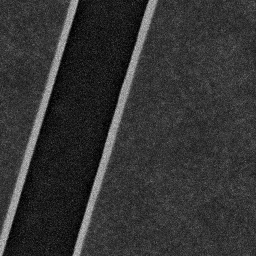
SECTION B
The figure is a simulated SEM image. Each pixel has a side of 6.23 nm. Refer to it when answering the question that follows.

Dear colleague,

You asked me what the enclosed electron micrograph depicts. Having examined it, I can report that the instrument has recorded one or a few lines or trenches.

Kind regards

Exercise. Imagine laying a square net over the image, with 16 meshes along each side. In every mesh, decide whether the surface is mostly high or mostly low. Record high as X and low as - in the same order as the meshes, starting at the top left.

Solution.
XXXXX----XXXXXXX
XXXX-----XXXXXXX
XXXX-----XXXXXXX
XXXX----XXXXXXXX
XXX-----XXXXXXXX
XXX-----XXXXXXXX
XXX-----XXXXXXXX
XX-----XXXXXXXXX
XX-----XXXXXXXXX
XX-----XXXXXXXXX
XX----XXXXXXXXXX
X-----XXXXXXXXXX
X-----XXXXXXXXXX
X----XXXXXXXXXXX
-----XXXXXXXXXXX
-----XXXXXXXXXXX